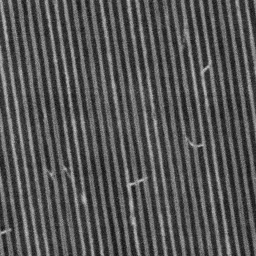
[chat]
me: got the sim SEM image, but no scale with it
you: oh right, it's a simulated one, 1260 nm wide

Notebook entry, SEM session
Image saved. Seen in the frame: parallel lines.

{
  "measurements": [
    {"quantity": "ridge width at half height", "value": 17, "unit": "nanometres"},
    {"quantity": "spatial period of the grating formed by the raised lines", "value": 44.3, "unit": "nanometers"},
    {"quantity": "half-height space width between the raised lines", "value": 30.5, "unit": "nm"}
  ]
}